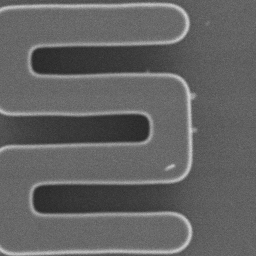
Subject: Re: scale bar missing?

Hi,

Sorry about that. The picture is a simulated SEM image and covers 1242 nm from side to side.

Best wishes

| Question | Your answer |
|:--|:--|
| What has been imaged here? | groups of lines, slits or small figures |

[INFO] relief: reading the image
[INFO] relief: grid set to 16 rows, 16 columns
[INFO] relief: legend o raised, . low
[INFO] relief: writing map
ooooooooooo.....
oooooooooooo....
ooooooooooo.....
oo..............
oo..............
oooooooooooo....
oooooooooooo....
.........ooo....
.........ooo....
oooooooooooo....
oooooooooooo....
oooo............
oo..............
ooooooooooo.....
oooooooooooo....
ooooooooooo.....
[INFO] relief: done